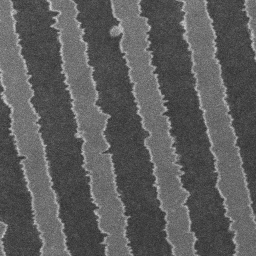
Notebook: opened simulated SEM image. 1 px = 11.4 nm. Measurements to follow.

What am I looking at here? one or a few lines or trenches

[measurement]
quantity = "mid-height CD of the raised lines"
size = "291 nm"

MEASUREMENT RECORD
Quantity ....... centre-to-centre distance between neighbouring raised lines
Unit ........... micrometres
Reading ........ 0.714